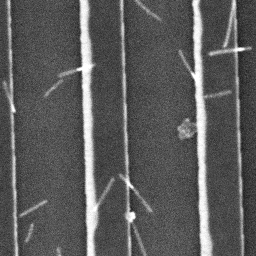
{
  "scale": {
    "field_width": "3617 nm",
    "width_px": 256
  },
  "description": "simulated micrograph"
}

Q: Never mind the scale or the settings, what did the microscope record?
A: lines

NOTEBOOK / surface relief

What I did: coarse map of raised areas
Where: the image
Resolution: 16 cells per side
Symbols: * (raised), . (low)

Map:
*....***....***.
*....***....***.
*....***....***.
*....***....***.
*....***....***.
*....***....***.
*....***....***.
*....***....***.
*....***.....**.
*....***.....**.
*....***.....**.
*....***.....**.
*.....**.....**.
*.....**.....**.
*.....**.....**.
*.....**.....**.